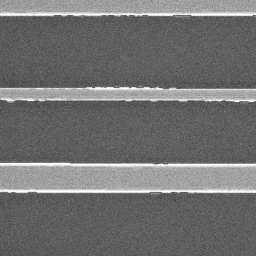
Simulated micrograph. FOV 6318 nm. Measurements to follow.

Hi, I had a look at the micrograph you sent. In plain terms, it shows lines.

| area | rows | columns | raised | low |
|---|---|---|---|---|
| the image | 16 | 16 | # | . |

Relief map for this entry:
################
................
................
................
................
................
................
................
................
................
################
################
................
................
................
................